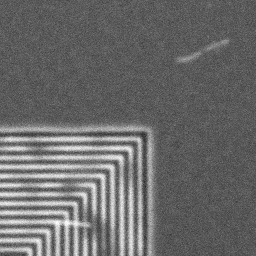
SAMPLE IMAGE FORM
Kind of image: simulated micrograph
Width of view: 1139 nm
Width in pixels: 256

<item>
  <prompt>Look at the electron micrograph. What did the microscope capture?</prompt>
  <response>groups of lines, slits or small figures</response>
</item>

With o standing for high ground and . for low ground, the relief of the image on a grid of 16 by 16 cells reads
oooooooooooooooo
oooooooooooooooo
oooooooooooooooo
oooooooooooooooo
oooooooooooooooo
oooooooooooooooo
oooooooooooooooo
oooooooooooooooo
.........ooooooo
.........ooooooo
.........ooooooo
.........ooooooo
.........ooooooo
.........ooooooo
.........ooooooo
.........ooooooo